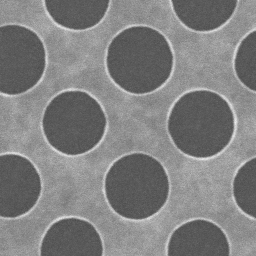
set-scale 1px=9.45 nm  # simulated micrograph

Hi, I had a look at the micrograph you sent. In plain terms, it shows holes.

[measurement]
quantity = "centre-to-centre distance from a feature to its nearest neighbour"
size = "89.2 px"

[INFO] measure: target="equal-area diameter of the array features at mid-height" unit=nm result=634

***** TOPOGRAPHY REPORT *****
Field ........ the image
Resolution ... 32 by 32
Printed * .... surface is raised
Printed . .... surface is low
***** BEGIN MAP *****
*****.........*******.........**
******.......*********.......***
*******......*********.......***
...*****...*****...*****...*****
.....*********......***********.
.....*********.......*********..
......*******.........*******...
......*******.........*******...
......*******.........*******...
.....*********.......*********..
.....*********......**********..
...*****...*****...*****...*****
******......**********......****
******.......********........***
*****........********........***
*****........********........***
*****........********........***
******.......********........***
*******.....**********......****
...************....*****...*****
....**********......**********..
.....********........*********..
.....********........********...
.....********........********...
.....********........********...
....**********.......*********..
...***********......**********..
*******....*************..******
******......**********.....*****
*****.......*********.......****
*****........********........***
*****........********........***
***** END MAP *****